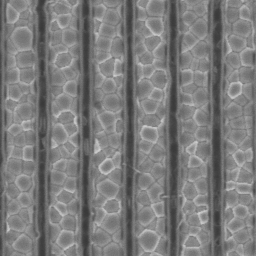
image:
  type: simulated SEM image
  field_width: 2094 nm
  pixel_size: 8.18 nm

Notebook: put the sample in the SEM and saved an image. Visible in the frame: parallel lines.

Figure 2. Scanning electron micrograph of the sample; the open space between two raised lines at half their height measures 269 nm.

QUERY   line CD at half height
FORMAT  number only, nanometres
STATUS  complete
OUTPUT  90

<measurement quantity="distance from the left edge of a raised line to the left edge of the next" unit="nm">357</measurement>